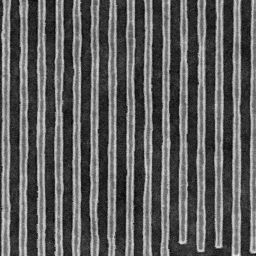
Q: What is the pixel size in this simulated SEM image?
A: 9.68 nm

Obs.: parallel lines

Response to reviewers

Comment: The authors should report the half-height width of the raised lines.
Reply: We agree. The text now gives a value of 54.4 nanometers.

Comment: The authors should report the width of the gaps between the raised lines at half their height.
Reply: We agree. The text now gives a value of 0.118 um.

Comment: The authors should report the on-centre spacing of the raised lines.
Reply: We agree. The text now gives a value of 172 nm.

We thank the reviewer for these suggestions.